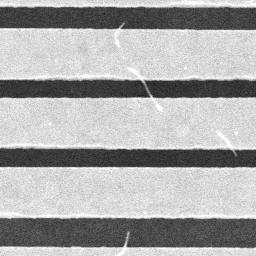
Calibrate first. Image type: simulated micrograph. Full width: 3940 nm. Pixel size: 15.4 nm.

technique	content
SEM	lines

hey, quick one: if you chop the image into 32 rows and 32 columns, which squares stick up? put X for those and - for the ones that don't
XXXXXXXXXXXXXXXXXXXXXXXXXXXXXXXX
--------------------------------
--------------------------------
--------------------------------
XXXXXXXXXXXXXXXXXXXXXXXXXXXXXXXX
XXXXXXXXXXXXXXXXXXXXXXXXXXXXXXXX
XXXXXXXXXXXXXXXXXXXXXXXXXXXXXXXX
XXXXXXXXXXXXXXXXXXXXXXXXXXXXXXXX
XXXXXXXXXXXXXXXXXXXXXXXXXXXXXXXX
XXXXXXXXXXXXXXXXXXXXXXXXXXXXXXXX
--------------------------------
--------------------------------
XXXXXXXXXXXXXXXXXXXXXXXXXXXXXXXX
XXXXXXXXXXXXXXXXXXXXXXXXXXXXXXXX
XXXXXXXXXXXXXXXXXXXXXXXXXXXXXXXX
XXXXXXXXXXXXXXXXXXXXXXXXXXXXXXXX
XXXXXXXXXXXXXXXXXXXXXXXXXXXXXXXX
XXXXXXXXXXXXXXXXXXXXXXXXXXXXXXXX
-------------XXXXXXXXXXXXXXXXXXX
--------------------------------
--------------------------------
XXXXXXXXXXXXXXXXXXXXXXXXXXXXXXXX
XXXXXXXXXXXXXXXXXXXXXXXXXXXXXXXX
XXXXXXXXXXXXXXXXXXXXXXXXXXXXXXXX
XXXXXXXXXXXXXXXXXXXXXXXXXXXXXXXX
XXXXXXXXXXXXXXXXXXXXXXXXXXXXXXXX
XXXXXXXXXXXXXXXXXXXXXXXXXXXXXXXX
--------------------------------
--------------------------------
--------------------------------
--------------------------------
XXXXXXXXXXXXXXXXXXXXXXXXXXXXXXXX